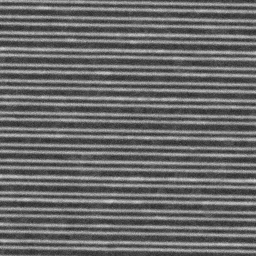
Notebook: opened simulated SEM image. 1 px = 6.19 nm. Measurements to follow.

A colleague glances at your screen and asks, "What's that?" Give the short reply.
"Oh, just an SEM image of parallel lines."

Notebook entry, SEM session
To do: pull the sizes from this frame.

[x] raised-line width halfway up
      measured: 13.1 nanometres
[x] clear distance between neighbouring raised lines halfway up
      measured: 30.2 nanometers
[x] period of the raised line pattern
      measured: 0.0493 micrometres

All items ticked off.